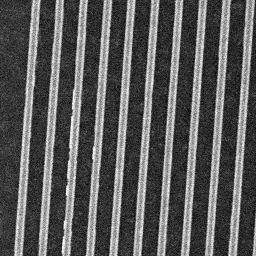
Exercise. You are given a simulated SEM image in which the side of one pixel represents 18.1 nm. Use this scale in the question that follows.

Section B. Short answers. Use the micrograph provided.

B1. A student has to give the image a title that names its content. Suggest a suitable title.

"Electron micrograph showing parallel lines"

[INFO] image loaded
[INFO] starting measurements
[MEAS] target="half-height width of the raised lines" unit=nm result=110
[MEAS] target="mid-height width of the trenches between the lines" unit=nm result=320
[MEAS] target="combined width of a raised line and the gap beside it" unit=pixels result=23.8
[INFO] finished